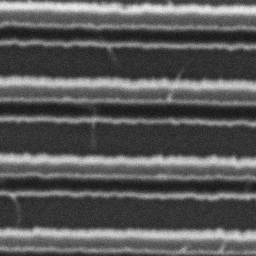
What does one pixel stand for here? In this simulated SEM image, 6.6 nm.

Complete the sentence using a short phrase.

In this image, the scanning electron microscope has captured lines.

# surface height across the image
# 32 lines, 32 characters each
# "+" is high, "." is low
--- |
................................
++++++++++++++++++++++++++++++++
++++++++++++++++++++++++++++++++
++++++++++++++++++++++++++++++++
++++++++++++++++++++++++++++++++
......+++.+.++++++++++++++++++++
................................
................................
................................
................................
+++++++++++++++.....+...........
++++++++++++++++++++++++++++++++
++++++++++++++++++++++++++++++++
++++++++++++++++++++++++++++++++
++++++++++++++++++++++++++++++++
...........................++..+
................................
................................
................................
................................
++++++++++++++++++++++++++++++++
++++++++++++++++++++++++++++++++
++++++++++++++++++++++++++++++++
++++++++++++++++++++++++++++++++
.+...............++++++.++++++++
................................
................................
................................
................................
++++++++++++++++++++++++++++....
++++++++++++++++++++++++++++++++
++++++++++++++++++++++++++++++++